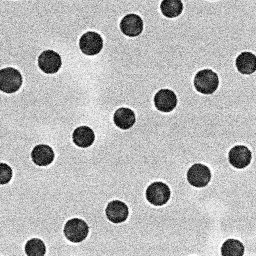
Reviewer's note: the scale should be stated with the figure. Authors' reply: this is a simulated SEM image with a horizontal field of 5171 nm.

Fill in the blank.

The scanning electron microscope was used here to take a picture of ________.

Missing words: a regular array of holes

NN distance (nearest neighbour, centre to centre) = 903 nm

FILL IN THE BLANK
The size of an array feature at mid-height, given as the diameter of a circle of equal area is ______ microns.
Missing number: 0.498